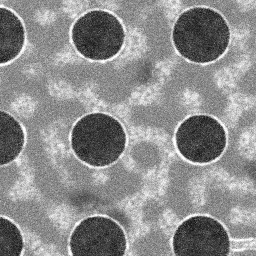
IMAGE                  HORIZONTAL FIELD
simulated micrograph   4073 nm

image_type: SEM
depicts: holes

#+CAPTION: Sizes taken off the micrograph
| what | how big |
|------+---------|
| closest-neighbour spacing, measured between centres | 1.63 um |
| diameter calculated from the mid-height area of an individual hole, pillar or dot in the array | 856 nm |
